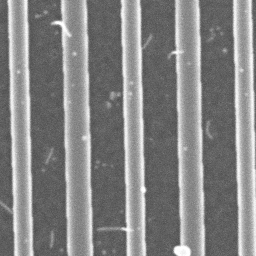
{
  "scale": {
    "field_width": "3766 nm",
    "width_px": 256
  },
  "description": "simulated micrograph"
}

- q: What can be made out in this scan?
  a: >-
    lines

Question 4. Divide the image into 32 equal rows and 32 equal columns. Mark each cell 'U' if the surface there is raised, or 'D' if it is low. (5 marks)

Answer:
DUUDDDDDUUUDDDDUUDDDDDUUUDDDDUUD
DUUDDDDDUUUDDDDUUUDDDDUUUDDDDUUD
DUUDDDDDUUUDDDDUUUDDDDUUUDDDDUUD
DUUDDDDDUUUDDDDUUUDDDDUUUDDDDUUD
DUUDDDDDUUUDDDDUUUDDDDUUUDDDDUUD
DUUDDDDDUUUDDDDUUUDDDDUUUDDDDUUD
DUUDDDDDUUUDDDDUUUDDDDUUUDDDDUUD
DUUDDDDDUUUDDDDUUUDDDDUUUDDDDUUU
DUUDDDDDUUUDDDDUUUDDDDUUUDDDDUUU
DUUUDDDDUUUDDDDUUUDDDDUUUDDDDUUU
DUUUDDDDUUUDDDDDUUDDDDUUUDDDDUUU
DUUUDDDDUUUDDDDDUUDDDDUUUDDDDUUU
DUUUDDDDUUUDDDDDUUDDDDUUUDDDDUUU
DUUUDDDDUUUDDDDDUUDDDDUUUDDDDUUU
DUUUDDDDUUUDDDDDUUDDDDUUUDDDDDUU
DUUUDDDDUUUDDDDDUUDDDDUUUDDDDDUU
DUUUDDDDUUUDDDDDUUDDDDUUUDDDDDUU
DDUUDDDDUUUDDDDDUUDDDDUUUDDDDDUU
DDUUDDDDUUUDDDDDUUDDDDUUUDDDDDUU
DDUUDDDDUUUDDDDDUUDDDDUUUDDDDDUU
DDUUDDDDUUUDDDDDUUDDDDUUUDDDDDUU
DDUUDDDDUUUDDDDDUUDDDDUUUDDDDDUU
DDUUDDDDUUUDDDDDUUDDDDUUUDDDDDUU
DDUUDDDDUUUDDDDDUUDDDDUUUDDDDDUU
DDUUDDDDUUUDDDDDUUDDDDDUUDDDDDUU
DDUUDDDDUUUDDDDDUUDDDDDUUDDDDDUU
DDUUDDDDUUUDDDDDUUDDDDDUUDDDDDUU
DDUUDDDDUUUDDDDDUUDDDDDUUDDDDDUU
DDUUDDDDUUUDDDDDUUDDDDDUUDDDDDUU
DDUUDDDDUUUDDDDDUUDDDDDUUDDDDDUU
DDUUDDDDUUUUDDDDUUDDDDUUUDDDDDUU
DDUUDDDDUUUUDDDDUUDDDDUUUDDDDDUU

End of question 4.